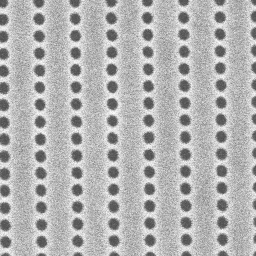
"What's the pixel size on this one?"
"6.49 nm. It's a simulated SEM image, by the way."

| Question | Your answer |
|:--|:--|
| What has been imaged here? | a regular array of holes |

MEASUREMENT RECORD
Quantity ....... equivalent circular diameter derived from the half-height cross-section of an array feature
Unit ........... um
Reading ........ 0.0785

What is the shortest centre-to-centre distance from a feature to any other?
110 nanometres